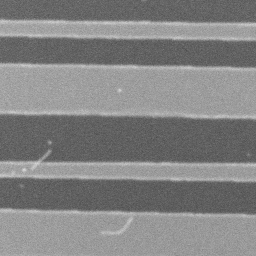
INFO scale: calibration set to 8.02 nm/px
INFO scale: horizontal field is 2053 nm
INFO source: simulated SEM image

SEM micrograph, lines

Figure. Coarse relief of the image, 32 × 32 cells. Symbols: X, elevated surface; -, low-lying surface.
--------------------------------
--------------------------------
--------------------------------
XXXXXXXXXXXXXXXXXXXXXXXXXXXXXXXX
---XXXXXXXXXXXXXXXXXXXXXXXXXXXXX
--------------------------------
--------------------------------
--------------------------------
XXXXXXXXXXXXXXXXXXXXXXXXXXXXX---
XXXXXXXXXXXXXXXXXXXXXXXXXXXXXXXX
XXXXXXXXXXXXXXXXXXXXXXXXXXXXXXXX
XXXXXXXXXXXXXXXXXXXXXXXXXXXXXXXX
XXXXXXXXXXXXXXXXXXXXXXXXXXXXXXXX
XXXXXXXXXXXXXXXXXXXXXXXXXXXXXXXX
------------------------XXXXXXXX
--------------------------------
--------------------------------
--------------------------------
--------------------------------
--------------------------------
XXXXXXXXXXXXXXXXXXX-X-----------
XXXXXXXXXXXXXXXXXXXXXXXXXXXXXXXX
-----------------------------XXX
--------------------------------
--------------------------------
--------------------------------
XXXXXXXXXX----------------------
XXXXXXXXXXXXXXXXXXXXXXXXXXXXXXXX
XXXXXXXXXXXXXXXXXXXXXXXXXXXXXXXX
XXXXXXXXXXXXXXXXXXXXXXXXXXXXXXXX
XXXXXXXXXXXXXXXXXXXXXXXXXXXXXXXX
XXXXXXXXXXXXXXXXXXXXXXXXXXXXXXXX